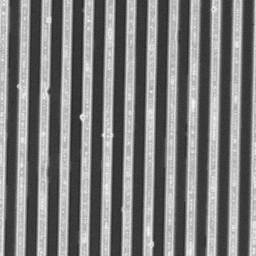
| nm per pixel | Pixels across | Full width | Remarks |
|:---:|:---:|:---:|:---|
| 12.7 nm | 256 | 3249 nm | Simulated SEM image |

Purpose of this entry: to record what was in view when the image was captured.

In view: parallel lines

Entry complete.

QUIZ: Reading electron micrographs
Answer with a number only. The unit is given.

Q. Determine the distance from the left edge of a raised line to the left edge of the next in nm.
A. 270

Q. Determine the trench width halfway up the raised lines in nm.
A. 159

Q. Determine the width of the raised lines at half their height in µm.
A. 0.111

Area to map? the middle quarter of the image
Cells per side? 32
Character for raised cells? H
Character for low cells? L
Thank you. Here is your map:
HHLLLHHLLLHHLLLHHHLLLHHLLLHHLLLL
HHLLLHHLLLHHLLLHHHLLLHHLLLHHLLLL
HHLLLHHLLLHHLLLHHHLLLHHLLLHHLLLL
HHLLLHHLLLHHLLLHHHLLLHHLLLHHLLLL
HHLLLHHLLLHHLLLHHHLLLHHLLLHHLLLH
HHLLLHHLLLHHLLLHHHLLLHHLLLHHLLLH
HHLLLHHLLLHHLLLHHLLLLHHLLLHHLLLH
HHLLLHHLLLHHLLLHHLLLLHHLLLHHLLLH
HHLLLHHLLLHHLLLHHLLLLHHLLLHHLLLH
HHLLLHHLLLHHLLLHHLLLLHHLLLHHLLLH
HHLLLHHLLLHHLLLHHLLLLHHLLLHHLLLH
HHLLLHHLLLHHLLLHHLLLLHHLLLHHLLLH
HLLLHHHLLLHHLLLHHLLLLHHLLLHHLLLH
HLLLHHHLLLHHLLLHHLLLHHHLLLHHLLLH
HLLLLHHLLLHHLLLHHLLLHHHLLLHHLLLH
HLLLLHHLLLHHLLLHHLLLHHHLLLHHLLLH
HLLLLHHLLLHHLLLHHLLLLHHLLLHHLLLH
HLLLLHHLLLHHLLLHHLLLLHHLLLHHLLLH
HLLLHHHLLLHHLLLHHLLLLHHLLLHHLLLH
HLLLHHHLLLHHLLLHHLLLLHHLLLHHLLLH
HLLLHHHLLLHHLLLHHLLLLHHLLLHHLLLH
HLLLHHHLLLHHLLLHHLLLLHLLLLHHLLLH
HLLLHHHLLLHHLLLHHLLLLHLLLLHHLLLH
HLLLHHHLLLHHLLLHHLLLLHLLLLHHLLLH
HLLLHHHLLLHHLLLHHLLLLHLLLLHHLLLH
HLLLHHHLLLHHLLLHHLLLHHLLLLHHLLLH
HLLLHHHLLLHHLLLHHLLLHHLLLLHHLLLH
HLLLHHLLLLHHLLLHHLLLHHLLLLHHLLLH
HLLLHHLLLLHHLLLHHLLLHHLLLLHHLLLH
HLLLHHLLLLHHLLLHHLLLHHLLLLHHLLLH
HLLLHHLLLLHHLLLHHLLLHHLLLLHHLLLH
HLLLHHLLLLHHLLLHHLLLHHLLLLHHLLLH